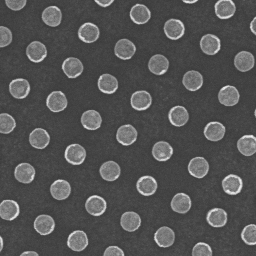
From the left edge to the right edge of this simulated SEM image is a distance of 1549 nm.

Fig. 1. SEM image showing a regular array of raised bodies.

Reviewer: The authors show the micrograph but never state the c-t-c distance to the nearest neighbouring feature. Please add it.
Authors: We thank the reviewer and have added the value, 228 nanometers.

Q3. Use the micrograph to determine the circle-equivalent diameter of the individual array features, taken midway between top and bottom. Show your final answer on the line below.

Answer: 20.5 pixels